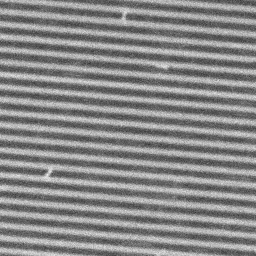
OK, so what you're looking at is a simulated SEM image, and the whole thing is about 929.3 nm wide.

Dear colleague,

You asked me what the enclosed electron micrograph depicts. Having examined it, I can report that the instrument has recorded parallel lines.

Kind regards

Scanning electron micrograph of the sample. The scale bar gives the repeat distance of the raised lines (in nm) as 45.5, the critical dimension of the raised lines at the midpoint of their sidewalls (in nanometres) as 17.6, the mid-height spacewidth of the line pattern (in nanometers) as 28.5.